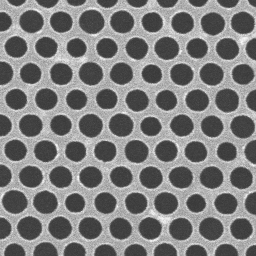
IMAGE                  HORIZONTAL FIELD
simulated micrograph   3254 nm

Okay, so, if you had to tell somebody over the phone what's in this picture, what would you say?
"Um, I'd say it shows a regular array of holes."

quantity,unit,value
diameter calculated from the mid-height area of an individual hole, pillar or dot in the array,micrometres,0.291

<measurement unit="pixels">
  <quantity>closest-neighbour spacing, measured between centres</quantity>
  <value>29.4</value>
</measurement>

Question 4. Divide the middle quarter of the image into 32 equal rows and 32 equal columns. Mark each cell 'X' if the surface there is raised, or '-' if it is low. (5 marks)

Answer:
-XXX-----XXX----XXXXX--XXXX----X
--XX------XX-----XXX----XXX-----
--XX------X------XX------X------
--XX------XX-----XXX----XXX-----
-XXXX----XXX----XXXX----XXX-----
XXXXXXXXXXXXXXXXXXXXXXXXXXXXX-XX
XX--XXXXX---XXXXX--XXXXXX-XXXXXX
X----XXX-----XXX-----XX-----XXX-
X-----XX-----XX------XX-----XX--
X-----XX-----XX------XX-----XX--
X----XXXX----XXX-----XX-----XXX-
XXX-XXXXXXXXXXXXX---XXXX---XXXXX
XXXXXX-XXXXXX--XXXXXXXXXXXXXX-XX
-XXX-----XXX-----XXX---XXXX-----
--XX------X------XX-----XXX-----
--XX------X-------X-----XX------
--XX------X------XX-----XXX-----
-XXXX----XXX----XXXX----XXXX----
XXXXXX-XXXXXXXXXXXXXXXXXXXXXXXXX
XX--XXXXX---XXXX----XXXX---XXXXX
X----XXX-----XX------XX-----XX--
------X------XX------XX-----XX--
------X------XX------XX-----XX--
X----XXX-----XXX-----XX-----XXX-
XX--XXXXXX-XXXXXX---XXXXXXXXXXXX
XXXXXX-XXXXXX--XXXXXXXXXXXXXXXXX
-XXXX----XXX----XXX-----XXX----X
--XX-----XX------XX------X------
--XX------X------XX------X------
--XX-----XXX-----XX------X------
-XXXX----XXXX---XXXX----XXX----X
XXXXXXXXXXXXXXXXXXXXXXXXXXXXXXXX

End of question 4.